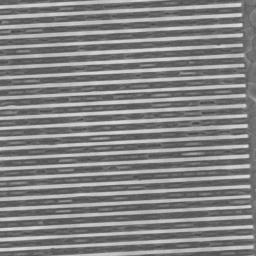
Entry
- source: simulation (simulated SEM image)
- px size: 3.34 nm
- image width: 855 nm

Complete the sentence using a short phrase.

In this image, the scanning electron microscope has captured parallel lines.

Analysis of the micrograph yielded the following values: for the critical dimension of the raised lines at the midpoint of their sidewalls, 3.38 pixels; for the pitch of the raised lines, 33.7 nm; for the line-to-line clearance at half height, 22.5 nm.